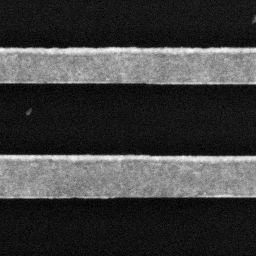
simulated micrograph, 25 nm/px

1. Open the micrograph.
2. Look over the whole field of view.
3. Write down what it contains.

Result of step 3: lines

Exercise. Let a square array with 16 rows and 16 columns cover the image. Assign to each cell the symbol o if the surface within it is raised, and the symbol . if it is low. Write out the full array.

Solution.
................
................
................
oooooooooooooooo
oooooooooooooooo
................
................
................
................
................
oooooooooooooooo
oooooooooooooooo
................
................
................
................